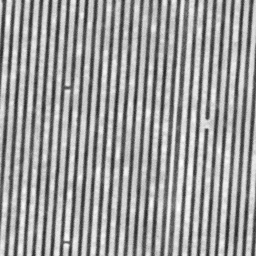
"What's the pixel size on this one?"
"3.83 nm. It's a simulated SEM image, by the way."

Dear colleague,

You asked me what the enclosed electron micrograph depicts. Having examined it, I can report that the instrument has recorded parallel lines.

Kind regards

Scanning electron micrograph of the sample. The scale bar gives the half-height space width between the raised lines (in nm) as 17.7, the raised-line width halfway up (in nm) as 17.7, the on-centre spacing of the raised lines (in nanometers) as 34.9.